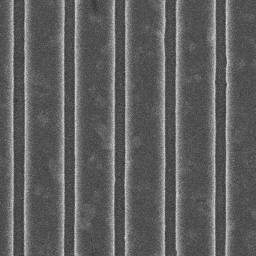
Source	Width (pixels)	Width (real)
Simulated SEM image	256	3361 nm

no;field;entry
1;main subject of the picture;parallel lines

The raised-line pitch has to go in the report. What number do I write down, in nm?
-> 662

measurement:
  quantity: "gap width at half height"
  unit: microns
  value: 0.148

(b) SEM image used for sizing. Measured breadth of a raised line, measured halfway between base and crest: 519 nanometers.